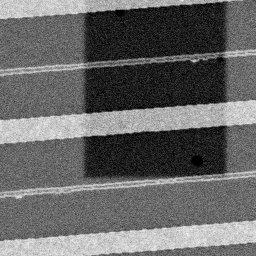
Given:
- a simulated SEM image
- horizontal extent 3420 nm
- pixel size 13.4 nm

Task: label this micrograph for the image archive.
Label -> lines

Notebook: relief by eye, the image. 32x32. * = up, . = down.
***********************.........
***********.....................
................................
................................
................................
................................
................................
................................
....**..........................
................................
................................
................................
................................
....................************
.......*************************
*******************************.
*****************...............
*****...........................
................................
................................
................................
................................
................................
................................
................................
................................
................................
................................
.....................***********
.........***********************
*****************************...
****************................